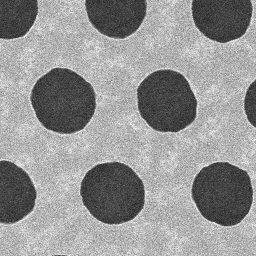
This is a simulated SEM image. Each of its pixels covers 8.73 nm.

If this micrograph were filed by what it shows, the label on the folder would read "holes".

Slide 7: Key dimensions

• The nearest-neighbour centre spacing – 904 nanometres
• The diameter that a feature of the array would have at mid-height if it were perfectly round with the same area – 548 nanometres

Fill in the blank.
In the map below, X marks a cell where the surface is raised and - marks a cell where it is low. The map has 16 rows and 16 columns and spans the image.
--XXX----XXX----
--XXXX---XXX----
XXXXXXXXXXXXX--X
XXXXXXXXXXXXXXXX
XXX--XXXXX-XXXXX
XX----XXX---XXXX
XX----XXX---XXX-
XX----XXX---XXXX
XXXXXXXXXXXXXXXX
XXXXXXXXXXXXXXXX
-XXXXX--XXXXX--X
--XXX----XXX----
--XXX----XXX----
--XXXX--XXXXX--X
XXXXXXXXXXXXXXXX
XXXXXXXXXXXXXXXX